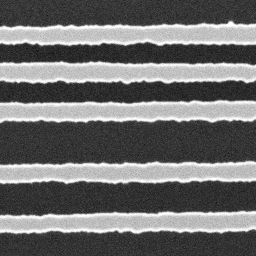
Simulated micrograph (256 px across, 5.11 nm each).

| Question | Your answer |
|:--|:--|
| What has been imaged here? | lines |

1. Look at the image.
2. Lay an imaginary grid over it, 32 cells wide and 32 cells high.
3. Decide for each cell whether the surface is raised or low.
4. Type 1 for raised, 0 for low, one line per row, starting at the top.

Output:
00000000000000000000000000000000
00000000000000000000000000000000
00000000000000000000000000000000
11111111111111111111111111111111
11111111111111111111111111111111
00000100100100010001100000000010
00000000000000000000000000000000
00000000000000000000000000000000
11111111111111111111111111111111
11111111111111111111111111111111
00000000000000000000000000000000
00000000000000000000000000000000
00000000000000000000000000000000
11111111111111111111111111111111
11111111111111111111111111111111
00000000000000000000000000000000
00000000000000000000000000000000
00000000000000000000000000000000
00000000000000000000000000000000
00000000000000000000000000000000
00001000111111011011111111111111
11111111111111111111111111111111
11111111111111111111111111111111
00000000000000000000000000000000
00000000000000000000000000000000
00000000000000000000000000000000
00000000000000000000000000000011
11111111111111111111111111111111
11111111111111111111111111111111
00000000000000000000000000000000
00000000000000000000000000000000
00000000000000000000000000000000